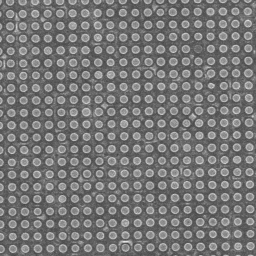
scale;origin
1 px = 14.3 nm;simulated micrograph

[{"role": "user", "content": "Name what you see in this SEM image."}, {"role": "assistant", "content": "a regular array of raised bodies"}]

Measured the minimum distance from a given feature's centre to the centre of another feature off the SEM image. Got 0.175 micrometres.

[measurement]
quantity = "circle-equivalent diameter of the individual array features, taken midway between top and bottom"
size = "104 nanometers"